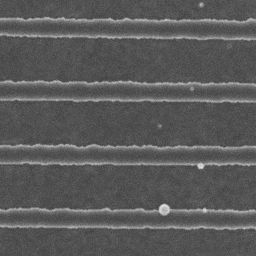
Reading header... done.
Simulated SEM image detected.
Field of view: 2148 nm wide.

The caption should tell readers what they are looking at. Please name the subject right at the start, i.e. lines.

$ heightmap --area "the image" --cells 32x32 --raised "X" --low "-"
--------------------------------
--------------------------------
XXXXXXXXXXXXXX-XXXX-XX-X-XX----X
XXXXXXXXXXXXXXXXXXXXXXXXXXXXXXXX
--XXXXXXXXXXXXXXXXXXXXXXXXXXXXXX
--------------------------------
--------------------------------
--------------------------------
--------------------------------
--------------------------------
XXXXXXXXXXXXXXXXXXXXXXXXX-XXXX--
XXXXXXXXXXXXXXXXXXXXXXXXXXXXXXXX
---------XXXX-XXXXXXXXXXXXXXXXXX
--------------------------------
--------------------------------
--------------------------------
--------------------------------
--------------------------------
XXXXXXXXXXXXXXXXXXXXXXXXXXXXXXXX
XXXXXXXXXXXXXXXXXXXXXXXXXXXXXXXX
-----X-XXXXXX-XXXXXXXXXXXXXXXXXX
--------------------------------
--------------------------------
--------------------------------
--------------------------------
--------------------------------
XXXXXXXXXXXXXXXXXXXXXXXXXXXXXXXX
XXXXXXXXXXXXXXXXXXXXXXXXXXXXXXXX
----------------X------X--XXXXX-
--------------------------------
--------------------------------
--------------------------------